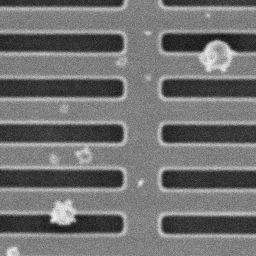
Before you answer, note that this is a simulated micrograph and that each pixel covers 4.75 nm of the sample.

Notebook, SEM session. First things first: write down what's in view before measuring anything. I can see groups of lines, slits or small figures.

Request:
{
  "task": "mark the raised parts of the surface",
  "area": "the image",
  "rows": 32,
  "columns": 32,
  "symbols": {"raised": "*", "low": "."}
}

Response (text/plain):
................****............
********************************
********************************
********************************
...............*****............
................****......**....
...............******....****...
********************************
********************************
********************************
................****............
................****............
********************************
********************************
********************************
...............******...........
................****............
...............*****............
********************************
********************************
********************************
...............*****............
................****............
...............*****............
********************************
********************************
********************************
.......**......*****............
...............*****............
********************************
********************************
********************************